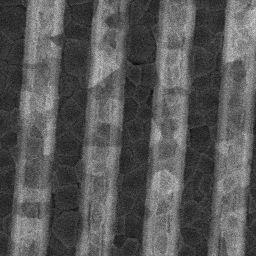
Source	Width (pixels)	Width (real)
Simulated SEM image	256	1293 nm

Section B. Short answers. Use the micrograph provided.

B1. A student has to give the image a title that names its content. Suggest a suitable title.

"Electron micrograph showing one or a few lines or trenches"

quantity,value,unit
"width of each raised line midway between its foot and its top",23.6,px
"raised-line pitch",65.8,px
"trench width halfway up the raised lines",215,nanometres